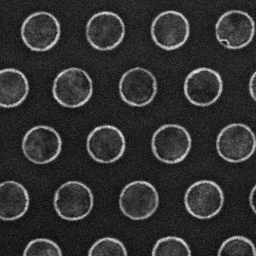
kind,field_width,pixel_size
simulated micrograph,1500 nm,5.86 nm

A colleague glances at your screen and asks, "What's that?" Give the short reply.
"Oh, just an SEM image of a regular array of raised bodies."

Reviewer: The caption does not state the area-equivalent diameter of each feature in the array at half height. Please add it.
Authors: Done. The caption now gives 221 nanometers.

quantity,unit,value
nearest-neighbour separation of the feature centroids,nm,379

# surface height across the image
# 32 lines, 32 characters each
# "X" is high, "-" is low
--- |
--------------------------------
---------------------X-------X--
---XXXX----XXXX----XXXX----XXXXX
---XXXX----XXXX----XXXXX---XXXXX
---XXXX----XXXX----XXXX----XXXXX
---XXXX-----XXX-----XXX-----XXX-
--------------------------------
--------------------------------
--------------------------------
XXX----XXXX----XXXX-----XXX-----
XXX----XXXX----XXXXX---XXXXX---X
XXX----XXXX----XXXX----XXXXX---X
XXX----XXXX-----XXX-----XXX-----
--------------------------------
--------------------------------
--------------------------------
----XXX-----XXX-----XXX-----XXX-
---XXXXX---XXXX----XXXXX---XXXXX
---XXXXX---XXXX----XXXXX---XXXXX
---XXXX-----XXX----XXXX-----XXX-
--------------------------------
--------------------------------
--------------------------------
XXX-----XXX-----XXX-----XXX-----
XXXX---XXXX----XXXXX---XXXXX---X
XXXX---XXXXX---XXXXX---XXXXX---X
XXX----XXXX-----XXX-----XXX-----
--------------------------------
--------------------------------
--------------------------------
----XXX-----XXX-----XXX-----XXX-
---XXXXX---XXXXX---XXXXX---XXXXX